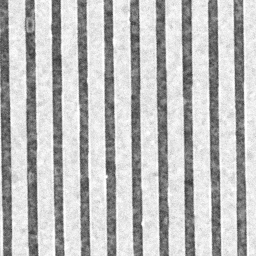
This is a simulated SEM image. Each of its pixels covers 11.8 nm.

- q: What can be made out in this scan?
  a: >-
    parallel lines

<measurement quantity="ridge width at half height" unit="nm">179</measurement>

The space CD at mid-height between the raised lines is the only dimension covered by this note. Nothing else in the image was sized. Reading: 122 nm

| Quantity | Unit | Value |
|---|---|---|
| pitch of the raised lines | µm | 0.307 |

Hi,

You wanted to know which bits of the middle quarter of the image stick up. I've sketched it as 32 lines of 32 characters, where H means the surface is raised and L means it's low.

HHHLLLHHHHLLLHHHLLLHHHHLLLHHHLLL
HHHLLLHHHHLLLHHHLLLHHHHLLLHHHLLL
HHHLLLHHHHLLLHHHLLLHHHHLLLHHHLLL
HHHLLLHHHHLLLHHHLLLHHHHLLLHHHLLL
HHHLLLHHHHLLLHHHLLLHHHHLLLHHHLLL
HHHLLLHHHHLLLHHHLLLHHHHLLLHHHLLL
HHHLLLHHHHLLLHHHLLLHHHHLLLHHHLLL
HHHLLLHHHHLLLHHHHLLHHHHLLLHHHHLL
HHHHLLHHHHLLLHHHHLLHHHHLLLHHHHLL
HHHHLLHHHHLLLHHHHLLHHHHLLLHHHHLL
HHHHLLHHHHLLLHHHHLLHHHHLLLHHHHLL
HHHHLLHHHHLLLHHHHLLHHHHLLLHHHHLL
HHHHLLHHHHLLLHHHHLLHHHHLLLHHHHLL
HHHHLLHHHHLLLHHHHLLHHHHLLLHHHHLL
HHHHLLHHHHLLLHHHHLLHHHHLLLHHHHLL
HHHHLLHHHHLLLHHHHLLHHHHLLLHHHHLL
HHHHLLHHHHLLLHHHHLLHHHHLLLHHHHLL
HHHHLLHHHHLLLHHHHLLHHHHLLLHHHHLL
HHHHLLHHHHLLLHHHHLLLHHHLLLHHHHLL
HHHHLLHHHHLLLHHHHLLLHHHLLLHHHHLL
HHHHLLHHHHLLLHHHHLLLHHHLLLHHHHLL
HHHHLLHHHHLLLHHHHLLLHHHLLLHHHHLL
HHHHLLHHHHLLLHHHHLLLHHHLLLHHHHLL
HHHHLLHHHHLLLHHHHLLLHHHLLLHHHHLL
HHHHLLHHHHLLLHHHHLLLHHHLLLHHHHLL
HHHHLLHHHHLLLHHHHLLLHHHLLLHHHHLL
HHHHLLHHHHLLLHHHHLLLHHHLLLHHHHLL
HHHHLLHHHHLLLHHHHLLLHHHLLLHHHHLL
HHHHLLHHHHLLLHHHHLLLHHHLLLHHHHLL
HHHHLLHHHHLLLHHHHLLLHHHLLLHHHHLL
HHHHLLHHHHLLLHHHHLLLHHHLLLHHHHLL
HHHHLLLHHHLLLHHHHLLLHHHLLLHHHHLL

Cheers